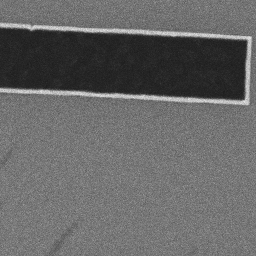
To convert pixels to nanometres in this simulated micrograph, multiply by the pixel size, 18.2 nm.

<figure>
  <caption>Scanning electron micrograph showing one or a few lines or trenches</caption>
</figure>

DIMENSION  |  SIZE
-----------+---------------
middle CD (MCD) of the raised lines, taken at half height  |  1190 nm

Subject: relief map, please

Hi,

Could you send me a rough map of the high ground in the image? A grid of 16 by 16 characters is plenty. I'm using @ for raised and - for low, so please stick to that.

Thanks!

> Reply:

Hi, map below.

----------------
----------------
@@@@@@@@@@@@@@@-
@@@@@@@@@@@@@@@@
@@@@@@@@@@@@@@@@
@@@@@@@@@@@@@@@-
----------------
----------------
----------------
----------------
----------------
----------------
----------------
----------------
----------------
----------------